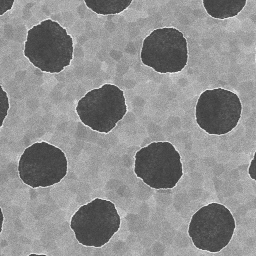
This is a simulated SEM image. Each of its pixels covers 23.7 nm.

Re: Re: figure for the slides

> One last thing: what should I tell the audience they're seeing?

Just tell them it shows a regular array of holes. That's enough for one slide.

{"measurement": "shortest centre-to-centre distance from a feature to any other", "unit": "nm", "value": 1900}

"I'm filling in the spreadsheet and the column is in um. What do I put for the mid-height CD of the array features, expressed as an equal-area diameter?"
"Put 1.13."